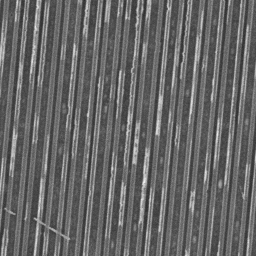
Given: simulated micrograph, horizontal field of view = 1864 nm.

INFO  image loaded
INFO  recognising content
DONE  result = parallel lines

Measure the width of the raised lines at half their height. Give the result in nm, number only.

32.6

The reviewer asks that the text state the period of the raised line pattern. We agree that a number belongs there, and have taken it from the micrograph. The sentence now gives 73.8 nanometres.